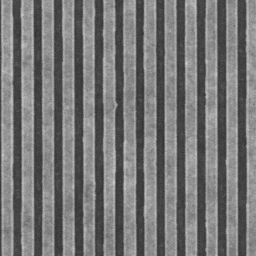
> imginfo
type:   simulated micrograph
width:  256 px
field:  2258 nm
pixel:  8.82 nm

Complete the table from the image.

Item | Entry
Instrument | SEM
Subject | parallel lines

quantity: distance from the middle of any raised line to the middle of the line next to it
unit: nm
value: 180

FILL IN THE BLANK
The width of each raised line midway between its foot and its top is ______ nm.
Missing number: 92.6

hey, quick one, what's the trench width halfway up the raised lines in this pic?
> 86 nanometres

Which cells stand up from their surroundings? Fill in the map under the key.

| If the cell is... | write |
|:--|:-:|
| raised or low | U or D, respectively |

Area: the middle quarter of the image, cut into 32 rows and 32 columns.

UUDDDUUDDDUUDDDUUUDDUUUDDUUUDDDU
UUDDDUUDDDUUDDDUUUDDUUUDDUUUDDDU
UUDDDUUDDDUUDDDUUUDDUUUDDUUUDDDU
UUDDDUUDDDUUDDDUUUDDUUUDDUUUDDDU
UUDDDUUDDDUUDDDUUUDDUUUDDUUUDDDU
UUDDDUUDDDUUDDDUUUDDUUUDDUUUDDDU
UUDDDUUDDDUUDDDUUUDDUUUDDUUUDDDU
UUDDDUUDDDUUDDDUUUDDUUUDDUUUDDDU
UUDDDUUDDDUUDDDUUUDDUUUDDUUUDDDU
UUDDDUUDDDUUUDDUUUDDUUUDDUUUDDDU
UUDDDUUDDDUUUDDUUUDDUUUDDUUUDDDU
UUDDDUUDDDUUUDDUUUDDUUUDDUUUDDDU
UUDDDUUDDDUUDDDUUUDDUUUDDUUUDDDU
UUDDDUUDDDUUDDDUUUDDUUUDDUUUDDDU
UUDDDUUDDDUUDDDUUDDDUUUDDUUUDDDU
UUDDDUUDDDUUDDDUUUDDUUUDDUUUDDDU
UUDDDUUDDDUUDDDUUUDDUUUDDUUUDDDU
UUDDDUUDDDUUDDDUUUDDUUUDDUUUDDDU
UUDDDUUDDDUUDDDUUUDDUUUDDUUUDDDU
UUDDDUUDDDUUDDDUUUDDUUUDDUUUDDDU
UUDDDUUDDDUUDDDUUUDDUUUDDUUUDDDU
UUDDDUUDDDUUDDDUUUDDUUUDDUUUDDDU
UUDDDUUDDDUUDDDUUUDDUUUDDUUUDDDU
UUDDDUUDDDUUDDDUUUDDUUUDDUUUDDDU
UUDDDUUDDDUUDDDUUUDDUUUDDUUUDDDU
UUDDDUUDDDUUDDDUUUDDUUUDDUUUDDDU
UUDDDUUDDDUUDDDUUUDDUUUDDUUUDDDU
UUDDDUUDDDUUDDDUUUDDUUUDDUUUDDDU
UUDDDUUDDDUUDDDUUUDDUUUDDUUUDDDU
UUDDDUUDDDUUDDDUUUDDUUUDDDUUDDDU
UUDDDUUDDDUUDDDUUUDDUUUDDDUUDDDU
UUDDDUUDDDUUDDDUUUDDUUUDDDUUDDDU